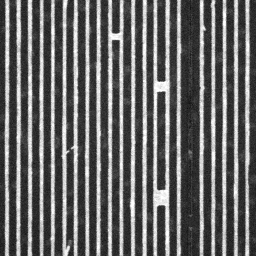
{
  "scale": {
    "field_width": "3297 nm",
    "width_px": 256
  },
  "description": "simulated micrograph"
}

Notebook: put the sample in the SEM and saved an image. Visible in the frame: parallel lines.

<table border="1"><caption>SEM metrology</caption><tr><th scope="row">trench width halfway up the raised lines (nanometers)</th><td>111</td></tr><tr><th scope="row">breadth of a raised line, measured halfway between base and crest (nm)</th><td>38.6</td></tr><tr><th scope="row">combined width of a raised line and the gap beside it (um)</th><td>0.147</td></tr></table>